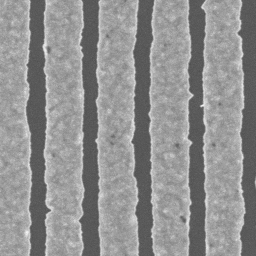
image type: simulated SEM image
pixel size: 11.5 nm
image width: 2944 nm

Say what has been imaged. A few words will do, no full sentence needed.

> parallel lines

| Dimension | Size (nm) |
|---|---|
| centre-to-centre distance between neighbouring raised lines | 608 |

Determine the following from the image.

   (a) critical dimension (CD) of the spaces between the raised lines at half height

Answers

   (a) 184 nm